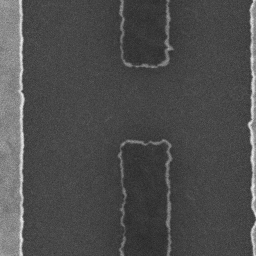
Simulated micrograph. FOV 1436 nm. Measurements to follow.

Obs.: one or a few lines or trenches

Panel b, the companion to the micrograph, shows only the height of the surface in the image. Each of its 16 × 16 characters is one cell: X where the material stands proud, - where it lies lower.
X-------XX------
X-------XXX-----
X-------XXX-----
X-------XX------
X---------------
X---------------
X---------------
X---------------
X---------------
X-------XXX-----
X-------XX------
X-------XXX-----
X-------XXX-----
X-------XXX-----
X-------XXX-----
X-------XXX-----